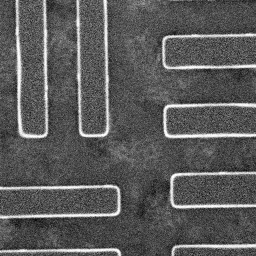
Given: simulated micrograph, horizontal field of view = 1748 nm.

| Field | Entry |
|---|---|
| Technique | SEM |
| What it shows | groups of lines, slits or small figures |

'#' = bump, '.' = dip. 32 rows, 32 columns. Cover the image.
..####....###...................
..####....###...................
..####....###...................
..####....###...................
..####....###........###########
..####....###.......############
..####....###.......############
..####....###.......############
..####....###...................
..####....###...................
..####....###...................
..####....###...................
..####....###...................
..####....###........###########
..####....###........###########
..####....###........###########
...###....###........###########
................................
................................
................................
................................
................................
.....................###########
...############......###########
###############......###########
###############.......##########
###############.................
................................
................................
................................
................................
###############.......##########